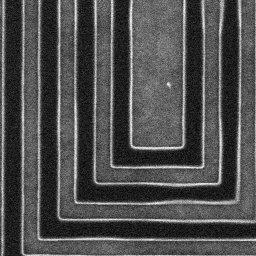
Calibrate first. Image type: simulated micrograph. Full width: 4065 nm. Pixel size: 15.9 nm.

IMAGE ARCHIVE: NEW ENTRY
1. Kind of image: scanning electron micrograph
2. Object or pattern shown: groups of lines, slits or small figures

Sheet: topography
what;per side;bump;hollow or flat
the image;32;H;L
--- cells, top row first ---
HHHLLHHLLHHHLLHHLLLLLLLHHLLLHHLL
HHHLLHHLLHHHLLHHLLLLLLLHHLLLHHLL
HHHLLHHLLHHHLLHHLLLLLLLHHLLLHHLL
HHHLLHHLLHHHLLHHLLLLLLLHHLLLHHLL
HHHLLHHLLHHHLLHHLLLLLLLHHLLLHHLL
HHHLLHHLLHHHLLHHLLLLLLLHHLLLHHLL
HHHLLHHLLHHHLLHHLLLLLLLHHLLHHHLL
HHHLLHHLLHHHLLHHLLLLLLLHHLLHHHLL
HHHLLHHLLHHHLLHHLLLLLLLHHLLLHHLL
HHHLLHHLLHHHLLHHLLLLLLLHHLLLHHLL
HHHLLHHLLHHHLLHHLLLLLLLHHLLHHHLL
HHHLLHHLLHHHLLHHLLLLLLLHHLLHHHLL
HHHLLHHLLHHHLLHHLLLLLLLHHLLHHHLL
HHHLLHHLLHHHLLHHLLLLLLLHHLLHHHLL
HHHLLHHLLHHHLLHHLLLLLLLHHLLHHHLL
HHHLLHHLLHHHLLHHLLLLLLLHHLLLHHLL
HHHLLHHLLHHHLLHHLLLLLLLHHLLLHHLL
HHHLLHHLLHHHLLHHLLLLLLLHHLLLHHLL
HHHLLHHLLHHHLLHHHHLLLHHHHLLLHHLL
HHHLLHHLLHHHLLHHHHHHHHHHHLLLHHLL
HHHLLHHLLHHHLLHHHHHHHHHHHLLLHHLL
HHHLLHHLLHHHLLLLLLLLLLLLLLLLHHLL
HHHLLHHLLHHHLLLLLLLLLLLLLLLHHHLL
HHHLLHHLLHHHHHHHHHHHHHHHHHHHHHLL
HHHLLHHLLHHHHHHHHHHHHHHHHHHHHHLL
HHHLLHHLLLLLLLLLLLLLLLLLLLLLLLLL
HHHLLHHLLLLLLLLLLLLLLLLLLLLLLLLL
HHHLLHHHHLLLLLHHHLLLLLLLLLLLLLLL
HHHLLHHHHHHHHHHHHHHHHHHHHHHHHHHH
HHHLLHHHHHHHHHHHHHHHHHHHHHHHHHHH
HHHLLLLLLLLLLLLLLLLLLLLLLLLLLLLL
HHHLLLLLLLLLLLLLLLLLLLLLLLLLLLLL